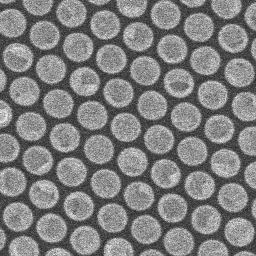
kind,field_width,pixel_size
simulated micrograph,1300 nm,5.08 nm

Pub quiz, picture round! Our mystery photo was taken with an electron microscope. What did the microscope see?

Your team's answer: a regular array of raised bodies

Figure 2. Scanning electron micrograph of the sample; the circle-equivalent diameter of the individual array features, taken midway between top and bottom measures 142 nm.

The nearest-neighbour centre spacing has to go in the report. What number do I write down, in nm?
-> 175